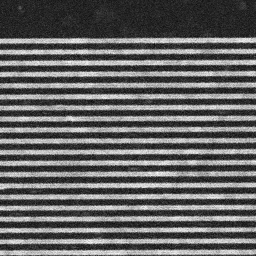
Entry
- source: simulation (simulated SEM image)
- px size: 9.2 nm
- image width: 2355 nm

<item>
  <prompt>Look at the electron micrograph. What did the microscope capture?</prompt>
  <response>parallel lines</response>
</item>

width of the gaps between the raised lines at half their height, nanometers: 70.2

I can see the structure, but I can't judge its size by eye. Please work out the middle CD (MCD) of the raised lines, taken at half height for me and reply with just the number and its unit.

35.7 nanometres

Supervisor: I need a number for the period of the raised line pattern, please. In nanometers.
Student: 103